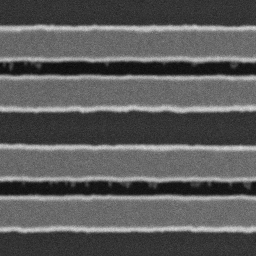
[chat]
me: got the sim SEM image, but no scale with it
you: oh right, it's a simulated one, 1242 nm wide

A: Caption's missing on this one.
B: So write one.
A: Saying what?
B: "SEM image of lines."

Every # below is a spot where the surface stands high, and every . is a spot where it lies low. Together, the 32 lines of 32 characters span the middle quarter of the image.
................................
................................
................................
################################
################################
################################
################################
################################
################################
################################
################################
#########..######.##############
................................
................................
................................
................................
................................
................................
................................
................................
#######......##.####..#..######.
################################
################################
################################
################################
################################
################################
################################
################################
................................
................................
................................